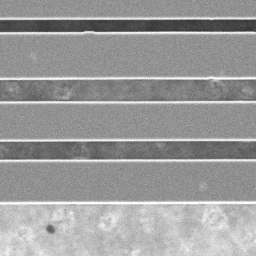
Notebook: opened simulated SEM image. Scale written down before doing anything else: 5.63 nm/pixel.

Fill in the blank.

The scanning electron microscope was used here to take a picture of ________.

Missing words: one or a few lines or trenches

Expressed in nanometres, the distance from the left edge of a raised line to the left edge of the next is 355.